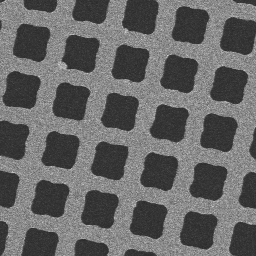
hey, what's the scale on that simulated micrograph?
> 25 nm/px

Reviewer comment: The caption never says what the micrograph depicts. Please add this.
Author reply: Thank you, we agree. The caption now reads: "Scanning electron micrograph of a regular array of holes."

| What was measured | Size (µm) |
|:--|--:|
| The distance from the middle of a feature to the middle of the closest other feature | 1.23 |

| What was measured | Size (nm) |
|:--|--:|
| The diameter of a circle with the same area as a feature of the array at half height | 938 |